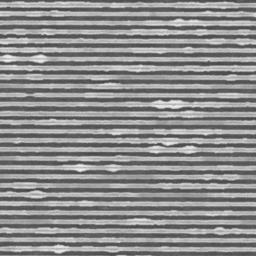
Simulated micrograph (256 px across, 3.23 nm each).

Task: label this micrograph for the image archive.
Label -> parallel lines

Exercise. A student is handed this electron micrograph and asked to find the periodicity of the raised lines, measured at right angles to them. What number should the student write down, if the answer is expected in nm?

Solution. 29.1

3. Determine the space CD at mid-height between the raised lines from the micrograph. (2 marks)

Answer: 14.5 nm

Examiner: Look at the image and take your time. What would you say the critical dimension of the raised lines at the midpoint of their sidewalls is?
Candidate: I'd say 14.1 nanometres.